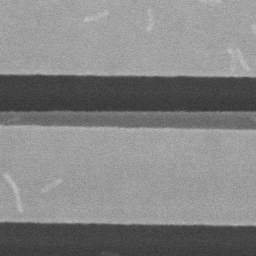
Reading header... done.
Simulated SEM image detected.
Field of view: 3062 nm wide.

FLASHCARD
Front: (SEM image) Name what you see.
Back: lines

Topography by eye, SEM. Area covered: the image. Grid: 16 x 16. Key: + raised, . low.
++++++++++++++++
++++++++++++++++
++++++++++++++++
++++++++++++++++
++++++++++++++++
................
................
................
++++++++++++++++
++++++++++++++++
++++++++++++++++
++++++++++++++++
++++++++++++++++
++++++++++++++++
................
................